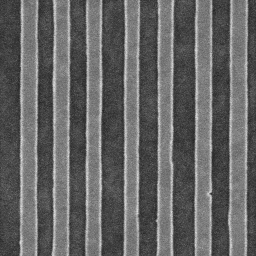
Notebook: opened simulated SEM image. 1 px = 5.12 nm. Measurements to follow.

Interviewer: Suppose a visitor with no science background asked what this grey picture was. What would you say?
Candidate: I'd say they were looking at parallel lines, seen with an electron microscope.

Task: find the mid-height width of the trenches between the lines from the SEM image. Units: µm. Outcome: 0.0972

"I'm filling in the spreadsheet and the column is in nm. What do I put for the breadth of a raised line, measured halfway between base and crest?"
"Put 75.5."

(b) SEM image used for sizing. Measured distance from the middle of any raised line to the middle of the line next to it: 179 nm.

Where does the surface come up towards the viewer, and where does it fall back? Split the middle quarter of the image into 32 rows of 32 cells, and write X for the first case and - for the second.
X-----XXX------XXX------XXX-----
X-----XXX------XXX------XXX-----
X-----XXX------XXX------XXX-----
X-----XXX------XXX------XXX-----
X-----XXX------XXX------XXX-----
X-----XXX------XXX------XXX-----
X-----XXX------XXX------XXX-----
X-----XXX------XXXX-----XXX-----
X-----XXX------XXXX-----XXX-----
X-----XXX------XXX------XXX-----
X-----XXX------XXXX-----XXX-----
X-----XXX------XXXX-----XXX-----
X-----XXX------XXXX-----XXX-----
X-----XXX------XXX------XXX-----
X-----XXX------XXXX-----XXX-----
X-----XXX------XXXX-----XXX-----
X-----XXX------XXXX-----XXX-----
X-----XXX------XXXX-----XXX-----
X-----XXX------XXXX-----XXX-----
X-----XXX------XXXX-----XXX-----
X-----XXX------XXX------XXX-----
X-----XXX------XXX------XXX-----
X-----XXX------XXX------XXX-----
X-----XXX------XXX------XXX-----
X-----XXX------XXX------XXX-----
X-----XXX------XXX------XXX-----
X-----XXX------XXXX-----XXX-----
X-----XXX------XXXX-----XXX-----
X-----XXX------XXXX-----XXX-----
X-----XXX------XXXX-----XXX-----
X-----XXX------XXXX-----XXX-----
X-----XXX------XXX------XXX-----